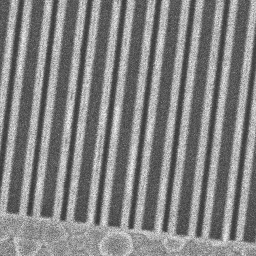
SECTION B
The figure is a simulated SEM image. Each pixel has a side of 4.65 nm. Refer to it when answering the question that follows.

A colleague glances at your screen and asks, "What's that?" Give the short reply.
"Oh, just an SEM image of parallel lines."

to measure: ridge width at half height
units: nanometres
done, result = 38.6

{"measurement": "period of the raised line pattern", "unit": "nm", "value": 79.1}